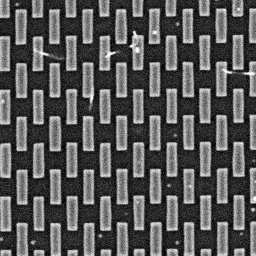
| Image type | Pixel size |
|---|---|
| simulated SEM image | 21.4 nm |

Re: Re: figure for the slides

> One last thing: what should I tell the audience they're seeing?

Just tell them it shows groups of lines, slits or small figures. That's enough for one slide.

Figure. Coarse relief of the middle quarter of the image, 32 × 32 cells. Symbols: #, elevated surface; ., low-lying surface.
.##..##..##..##..###..##..##..##
.##..##..##..##.......##......##
.....##......##.......##......##
.....##......##.......##......##
.....##......##.......##......##
.....##......##.......##......##
..#..##......###......##..##..##
.##..##..##..###.###..##..##..##
.##...#..##......###......##....
.##......##......###......##....
.##......##......###......##....
.##......###.....###......##....
.##......##......###......##....
.##..##..##..###.###..##..##..##
.##..##..##..###.###..##..##..##
.....##......###......##......##
.....##......###......##......##
.....##......###......##......##
.....##......###......##......##
.....##......###......##......##
.##..##..##..###.###..##..##..##
.##..##..##......###......##....
.##......###.....###......##....
.##......###.....###......##....
.##......###.....###......##....
.##......###.....###......##....
.##......###.###.###..##..##..##
.##..##..###.###.###..##..##..##
.....##......###......##......##
.....##......###......##......##
.....##......###......##......##
.....##......###......##......##